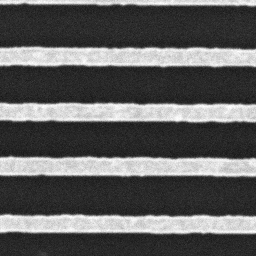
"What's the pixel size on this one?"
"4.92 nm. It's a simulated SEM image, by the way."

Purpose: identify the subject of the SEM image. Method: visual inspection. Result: lines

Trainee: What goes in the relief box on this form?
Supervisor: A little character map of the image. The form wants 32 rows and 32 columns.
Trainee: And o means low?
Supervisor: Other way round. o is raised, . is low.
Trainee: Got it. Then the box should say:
............oo.o.ooooooooooooooo
................................
................................
................................
................................
................................
oooooooooooooooooooooooooooooooo
oooooooooooooooooooooooooooooooo
................................
................................
................................
................................
................................
oooooooooooooooooooooooooooooooo
oooooooooooooooooooooooooooooooo
................................
................................
................................
................................
................................
oooooooooooooooooooooooooooooooo
oooooooooooooooooooooooooooooooo
................................
................................
................................
................................
................................
oooooooooooooooooooooooooooooooo
oooooooooooooooooooooooooooooooo
................................
................................
................................